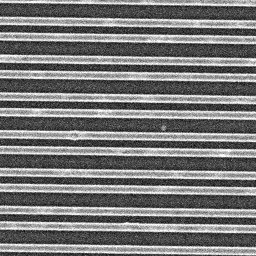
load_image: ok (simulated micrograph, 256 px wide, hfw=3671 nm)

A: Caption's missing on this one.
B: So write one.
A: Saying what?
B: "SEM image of parallel lines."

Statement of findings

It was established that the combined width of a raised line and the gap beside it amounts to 271 nm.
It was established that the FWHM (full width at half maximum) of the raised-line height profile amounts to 7.25 pixels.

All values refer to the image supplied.